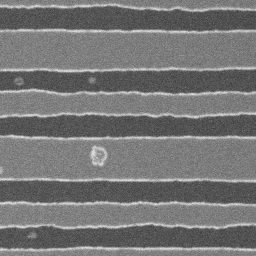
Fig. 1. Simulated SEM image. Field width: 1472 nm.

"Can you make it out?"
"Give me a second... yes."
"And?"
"lines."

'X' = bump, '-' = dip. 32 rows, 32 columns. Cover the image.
XXXXXXXXXXXXXXXXXXXXXXXXXXXXXXXX
--------------------------------
--------------------------------
--------------------------------
XXXXXXXXXXXXXXXXXXXXXXXXXXXXXXXX
XXXXXXXXXXXXXXXXXXXXXXXXXXXXXXXX
XXXXXXXXXXXXXXXXXXXXXXXXXXXXXXXX
XXXXXXXXXXXXXXXXXXXXXXXXXXXXXXXX
XXXXXXXXXXXXXXXXXXXXXXXXXXXXXXXX
--------------------------------
--------------------------------
XXXXXX--------------------------
XXXXXXXXXXXXXXXXXXXXXXXXXXXXXXXX
XXXXXXXXXXXXXXXXXXXXXXXXXXXXXXXX
X----X-------------X--XXXX------
--------------------------------
--------------------------------
XXXXXXXXXXXXXXXXXXXXXXXXXXXXXXXX
XXXXXXXXXXXXXXXXXXXXXXXXXXXXXXXX
XXXXXXXXXXXXXXXXXXXXXXXXXXXXXXXX
XXXXXXXXXXXXXXXXXXXXXXXXXXXXXXXX
XXXXXXXXXXXXXXXXXXXXXXXXXXXXXXXX
-------XXXX--XXXXXXXXXXXX-XXXXXX
--------------------------------
--------------------------------
XXXXXXXXXXXXXXXXXXXXXXXXXXX-XXX-
XXXXXXXXXXXXXXXXXXXXXXXXXXXXXXXX
XXXXXXXXXXXXXXXXXXXXXXXXXXXXXXXX
--------X-----------------------
--------------------------------
--------------------------------
XXXXXXXXXXXXXXXXXXXXXXXXXXXXXXXX